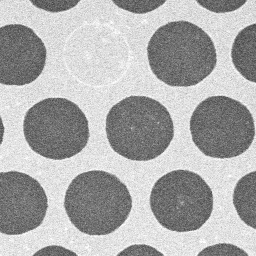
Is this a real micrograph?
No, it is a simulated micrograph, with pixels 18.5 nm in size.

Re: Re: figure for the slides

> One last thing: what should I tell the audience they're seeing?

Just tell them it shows holes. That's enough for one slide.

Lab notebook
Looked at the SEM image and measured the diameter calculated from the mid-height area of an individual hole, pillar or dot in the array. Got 1200 nanometres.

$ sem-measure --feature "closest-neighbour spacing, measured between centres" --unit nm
1540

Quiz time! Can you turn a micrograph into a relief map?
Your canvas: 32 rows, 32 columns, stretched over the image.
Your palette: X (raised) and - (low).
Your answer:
XXXX------XXXX------XXXXX-----XX
XXXXXX--XXXXXXXX---XXXXXXXX--XXX
XXXXXXXXXXXXXXXXXXXXXXXXXXXXXXXX
----XXXXXXXXXXXXXXXX-----XXXXXX-
-----XXXXXXXXXXXXXX-------XXXX--
-----XXXXXXXXXXXXXX--------XX---
------XXXXXXXXXXXX---------XX---
------XXXXXXXXXXXXX--------XX---
-----XXXXXXXXXXXXXX--------XX---
-----XXXXXXXXXXXXXX-------XXXX--
---XXXXXXXXXXXXXXXXXX----XXXXXXX
XXXXXXXXXXXXXXXXXXXXXXXXXXXXXXXX
XXXXX----XXXXXX----XXXXXX----XXX
XXXX------XXXX-------XXXX------X
XXX--------XX--------XXX-------X
XXX--------XX---------XX--------
-XX--------XX---------XX--------
XXX--------XXX-------XXX--------
XXXX-------XXX-------XXXX------X
XXXXX----XXXXXX-----XXXXXX----XX
XXXXXXXXXXXXXXXXXXXXXXXXXXXXXXXX
X--XXXXXXXX--XXXXXXXX---XXXXXXXX
----XXXXX------XXXXX------XXXX--
-----XXX--------XXX-------XXX---
------XX--------XXX--------XX---
------XX---------XX--------XX---
------XX--------XXX-------XXXX--
-----XXXX-------XXXX------XXXX--
----XXXXXX-----XXXXXX----XXXXXXX
XXXXXXXXXXXXXXXXXXXXXXXXXXXXXXXX
XXXXXXXXXXXXXXXXX-XXXXXXXXX--XXX
XXXXX----XXXXXX-----XXXXX------X